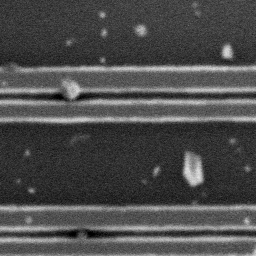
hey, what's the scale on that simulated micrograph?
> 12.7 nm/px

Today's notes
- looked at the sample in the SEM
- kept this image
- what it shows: lines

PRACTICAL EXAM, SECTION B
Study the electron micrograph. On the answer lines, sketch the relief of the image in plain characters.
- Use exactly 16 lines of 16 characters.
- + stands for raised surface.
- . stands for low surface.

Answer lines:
................
................
................
................
++++++++++++++++
++++++++++++++++
++++++++++++++++
...+............
................
................
................
................
................
++++++++++++++++
++++++++++++++++
++++++++++++++++